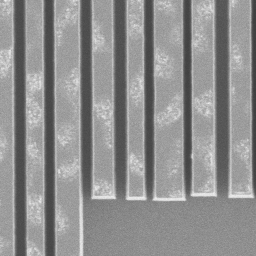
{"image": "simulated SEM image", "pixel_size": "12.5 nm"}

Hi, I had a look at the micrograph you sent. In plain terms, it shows parallel lines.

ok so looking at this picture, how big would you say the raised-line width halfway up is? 291 nm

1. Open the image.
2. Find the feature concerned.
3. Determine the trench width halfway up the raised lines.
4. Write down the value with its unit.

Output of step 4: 139 nm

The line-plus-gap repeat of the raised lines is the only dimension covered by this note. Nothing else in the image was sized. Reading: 425 nanometres